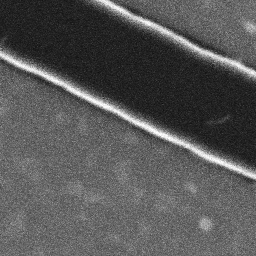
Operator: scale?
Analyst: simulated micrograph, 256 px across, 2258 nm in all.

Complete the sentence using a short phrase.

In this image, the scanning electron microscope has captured one or a few lines or trenches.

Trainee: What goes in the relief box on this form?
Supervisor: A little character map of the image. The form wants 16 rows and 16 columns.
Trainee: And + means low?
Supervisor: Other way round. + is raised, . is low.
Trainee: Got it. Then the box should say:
+++++++.........
++++++++++......
+++++++++++.....
+++++++++++++...
..++++++++++++++
....++++++++++++
......++++++++++
........++++++++
..........++++++
............++++
...............+
................
................
................
................
................